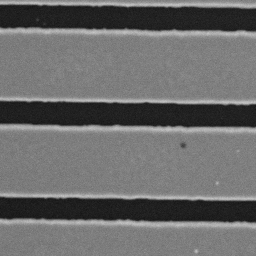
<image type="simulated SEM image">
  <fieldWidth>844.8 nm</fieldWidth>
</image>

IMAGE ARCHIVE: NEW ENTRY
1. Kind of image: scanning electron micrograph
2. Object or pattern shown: lines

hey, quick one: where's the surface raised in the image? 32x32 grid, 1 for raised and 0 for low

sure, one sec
11111111111111111111111111111111
00000000000000000000000000000000
00000000000000000000000000000000
00100000000000000000000000000000
11111111111111111111111111111111
11111111111111111111111111111111
11111111111111111111111111111111
11111111111111111111111111111111
11111111111111111111111111111111
11111111111111111111111111111111
11111111111111111111111111111111
11111111111111111111111111111111
11111111111111111111111111111111
00000000000000000000000000000000
00000000000000000000000000000000
00000000000000000000000000000000
11111111111111111111111111111111
11111111111111111111111111111111
11111111111111111111111111111111
11111111111111111111111111111111
11111111111111111111111111111111
11111111111111111111111111111111
11111111111111111111111111111111
11111111111111111111111111111111
11111111111111111111111111111111
00000000000000000000000000000000
00000000000000000000000000000000
11111111111100010000000000000000
11111111111111111111111111111111
11111111111111111111111111111111
11111111111111111111111111111111
11111111111111111111111111111111